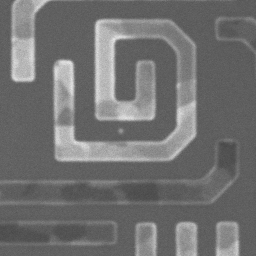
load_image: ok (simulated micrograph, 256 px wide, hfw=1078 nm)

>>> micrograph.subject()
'wiring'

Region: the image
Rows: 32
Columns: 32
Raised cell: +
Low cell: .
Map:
..+++...........................
..++............................
..++........................+++.
..++........++++++++++.....+++++
..++........+++++++++++....+++++
..++........++.......+++.......+
..++........++........++........
..++........++........++........
..++...++...++...++...++........
..++...++...++...++...++........
.......++...++...++...++........
.......++...++...++...++........
.......++...++...++...++........
.......++...+++++++...++........
.......++...+++++++...++........
.......++.............++........
.......++.............++........
.......++............+++........
.......++++++++++++++++....+++..
.......+++++++++++++++.....+++..
...........................+++..
..........................++++..
.........................++++...
++++++++++++++++++++++++++++....
+++++++++++++++++++++++++++.....
................................
................................
................................
++++++++++++++...++...++...+++..
++++++++++++++...++...++...+++..
.................++...++...+++..
.................++...++...+++..